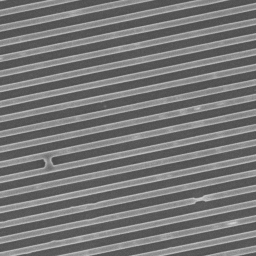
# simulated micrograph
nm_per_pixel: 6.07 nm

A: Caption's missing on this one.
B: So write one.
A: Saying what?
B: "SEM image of parallel lines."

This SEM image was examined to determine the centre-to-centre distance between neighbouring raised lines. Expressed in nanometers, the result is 90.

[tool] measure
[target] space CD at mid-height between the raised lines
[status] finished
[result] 51.2 nanometers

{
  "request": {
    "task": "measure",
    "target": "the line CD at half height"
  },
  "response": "6 px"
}